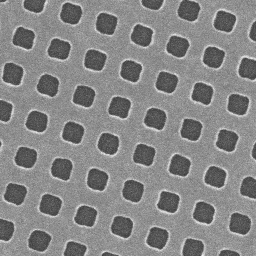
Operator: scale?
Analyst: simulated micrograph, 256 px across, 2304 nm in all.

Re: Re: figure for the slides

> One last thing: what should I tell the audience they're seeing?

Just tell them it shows a regular array of holes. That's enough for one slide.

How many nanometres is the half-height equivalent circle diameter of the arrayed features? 203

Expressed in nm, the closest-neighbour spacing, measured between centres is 335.